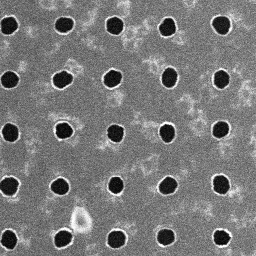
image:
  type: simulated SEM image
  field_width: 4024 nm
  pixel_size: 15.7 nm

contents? a regular array of holes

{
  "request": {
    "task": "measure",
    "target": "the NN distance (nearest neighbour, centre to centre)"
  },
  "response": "805 nm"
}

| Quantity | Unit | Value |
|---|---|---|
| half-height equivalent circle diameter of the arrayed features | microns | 0.28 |